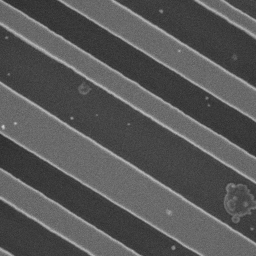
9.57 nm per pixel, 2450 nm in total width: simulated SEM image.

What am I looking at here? lines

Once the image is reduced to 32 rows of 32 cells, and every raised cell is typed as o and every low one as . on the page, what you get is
o.......ooooooo..........oooo...
ooo.......ooooooo..........ooo..
oooo.......ooooooo..........oooo
.ooooo.......ooooooo..........oo
..oooooo.......oooooo...........
....ooooo.......ooooooo.........
......ooooo.......ooooooo.......
.......ooooo.......ooooooo......
.........ooooo.......ooooooo....
..........ooooo........oooooo...
............ooooo.......ooooooo.
oo............ooooo.......oooooo
oooo...........ooooo........oooo
ooooo............ooooo.......ooo
ooooooo............ooooo.......o
oooooooo............ooooo.......
oooooooooo............ooooo.....
.oooooooooo............ooooo....
...oooooooooo............ooooo..
.....oooooooooo...........oooooo
......oooooooooo............oooo
o.......oooooooooo............oo
oo........ooooooooo............o
oooo.......oooooooooo...........
oooooo.......oooooooooo.........
.oooooo.......oooooooooo........
...oooooo.......oooooooooo......
....oooooo........ooooooooo.....
......oooooo.......oooooooooo...
........oooooo.......ooooooooo..
.........oooooo........ooooooooo
o..........oooooo.......oooooooo